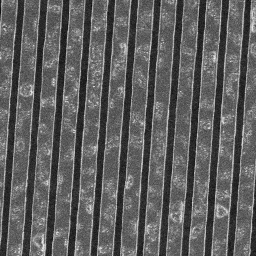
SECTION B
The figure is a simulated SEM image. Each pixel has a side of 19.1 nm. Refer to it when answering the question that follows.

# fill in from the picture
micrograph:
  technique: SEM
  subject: parallel lines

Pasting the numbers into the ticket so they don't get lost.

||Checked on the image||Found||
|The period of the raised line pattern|433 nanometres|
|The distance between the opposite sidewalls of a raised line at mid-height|295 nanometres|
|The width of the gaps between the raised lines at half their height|133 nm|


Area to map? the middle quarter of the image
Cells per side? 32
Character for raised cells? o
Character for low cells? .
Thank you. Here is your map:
oooo..oooo..oooo..ooo..oooo..ooo
oooo..oooo..ooo..oooo..oooo..ooo
oooo..oooo..ooo..oooo..oooo..ooo
oooo..oooo..ooo..oooo..oooo..ooo
oooo..ooo...ooo..oooo..oooo..ooo
oooo..ooo...ooo..oooo..oooo..ooo
oooo..ooo..oooo..oooo..oooo..ooo
oooo..ooo..oooo..oooo..oooo.oooo
oooo..ooo..oooo..oooo..ooo..oooo
oooo.oooo..oooo..oooo..ooo..oooo
ooo..oooo..oooo..ooo...ooo..oooo
ooo..oooo..oooo..ooo...ooo..oooo
ooo..oooo..oooo..ooo..oooo..oooo
ooo..oooo..ooo...ooo..oooo..oooo
ooo..oooo..ooo...ooo..oooo..oooo
ooo..oooo..ooo..oooo..oooo..oooo
ooo..oooo..ooo..oooo..oooo..oooo
ooo..oooo..ooo..oooo..oooo..ooo.
ooo..ooo...ooo..oooo..oooo..ooo.
ooo..ooo...ooo..oooo..oooo..ooo.
ooo..ooo..oooo..oooo..oooo..ooo.
ooo..ooo..oooo..oooo..ooo..oooo.
ooo..ooo..oooo..oooo..ooo..oooo.
ooo.oooo..oooo..oooo.oooo..oooo.
oo..oooo..oooo..oooo.oooo..oooo.
oo..oooo..oooo..ooo..oooo..oooo.
oo..oooo..oooo..ooo..oooo..oooo.
oo..oooo..oooo..ooo..oooo..oooo.
oo..oooo..oooo..ooo..oooo..oooo.
oo..oooo..oooo.oooo..oooo..oooo.
oo..oooo..ooo..oooo..oooo..oooo.
oo..oooo..ooo..oooo..oooo..ooo..